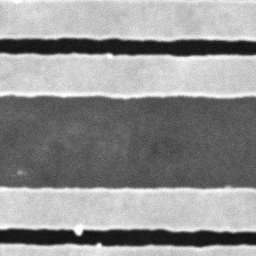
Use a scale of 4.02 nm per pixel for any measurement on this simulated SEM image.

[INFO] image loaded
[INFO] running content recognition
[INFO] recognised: lines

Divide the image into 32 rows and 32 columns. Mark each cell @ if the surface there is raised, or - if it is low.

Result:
@@@@@@@@@@@@@@@@@@@@@@@@@@@@@@@@
@@@@@@@@@@@@@@@@@@@@@@@@@@@@@@@@
@@@@@@@@@@@@@@@@@@@@@@@@@@@@@@@@
@@@@@@@@@@@@@@@@@@@@@@@@@@@@@@@@
@@@@@@@@@@@@@@@@@@@@@@@@@@@@@@@@
--------------------------------
--------------------------------
@@@@@@@@@@@@@@@@@@@@@@@@@@@@@@@@
@@@@@@@@@@@@@@@@@@@@@@@@@@@@@@@@
@@@@@@@@@@@@@@@@@@@@@@@@@@@@@@@@
@@@@@@@@@@@@@@@@@@@@@@@@@@@@@@@@
@@@@@@@@@@@@@@@@@@@@@@@@@@@@@@@@
--------------------------------
--------------------------------
--------------------------------
--------------------------------
--------------------------------
--------------------------------
--------------------------------
--------------------------------
--------------------------------
--------------------------------
--------------------------------
@-------------------------------
@@@@@@@@@@@@@@@@@@@@@@@@@@@@@@@@
@@@@@@@@@@@@@@@@@@@@@@@@@@@@@@@@
@@@@@@@@@@@@@@@@@@@@@@@@@@@@@@@@
@@@@@@@@@@@@@@@@@@@@@@@@@@@@@@@@
@@@@@@@@@@@@@@@@@@@@@@@@@@@@@@@@
--------------------------------
@-------------------------------
@@@@@@@@@@@@@@@@@@@@@@@@@@@@@@@@